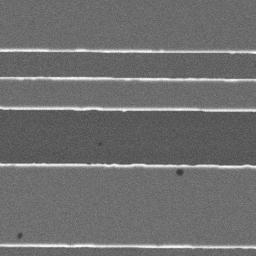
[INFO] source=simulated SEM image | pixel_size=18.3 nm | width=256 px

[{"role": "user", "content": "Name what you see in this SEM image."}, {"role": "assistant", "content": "lines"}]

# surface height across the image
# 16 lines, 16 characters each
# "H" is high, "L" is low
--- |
HHHHHHHHHHHHHHHH
HHHHHHHHHHHHHHHH
HHHHHHHHHHHHHHHH
HHHHHHHHHHHHHHHH
HHHHHHHHHHHHHHHH
HHHHHHHHHHHHHHHH
HHHHHHHHHHHHHHHH
LLLLLLLLLLLLLLLL
LLLLLLLLLLLLLLLL
LLLLLLLLLLLLLLLL
HHHHHHHHHHHHHHHH
HHHHHHHHHHHHHHHH
HHHHHHHHHHHHHHHH
HHHHHHHHHHHHHHHH
HHHHHHHHHHHHHHHH
HHHHHHHHHHHHHHHH